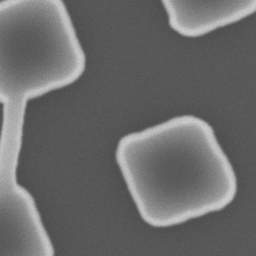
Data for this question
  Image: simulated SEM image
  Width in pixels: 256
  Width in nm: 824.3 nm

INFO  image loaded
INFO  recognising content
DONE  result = raised bodies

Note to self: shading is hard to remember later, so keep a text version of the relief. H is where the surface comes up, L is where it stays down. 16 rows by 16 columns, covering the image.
HHHHLLLLLLLHHHHH
HHHHLLLLLLLHHHLL
HHHHHLLLLLLLLLLL
HHHHHLLLLLLLLLLL
HHHHHLLLLLLLLLLL
HHHLLLLLLLLLLLLL
HHLLLLLLLLLLLLLL
HLLLLLLLLLLHLLLL
HLLLLLLLHHHHHLLL
HLLLLLLHHHHHHHLL
HLLLLLLLHHHHHHLL
HLLLLLLLHHHHHHHL
HHLLLLLLLHHHHHLL
HHLLLLLLLHHHLLLL
HHHLLLLLLLLLLLLL
HHHLLLLLLLLLLLLL